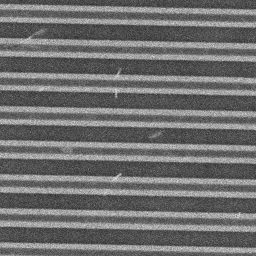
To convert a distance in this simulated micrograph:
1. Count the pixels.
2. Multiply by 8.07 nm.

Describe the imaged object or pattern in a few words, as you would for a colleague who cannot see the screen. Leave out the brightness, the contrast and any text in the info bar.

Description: parallel lines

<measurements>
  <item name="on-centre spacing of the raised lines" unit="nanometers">275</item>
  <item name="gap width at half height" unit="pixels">20.9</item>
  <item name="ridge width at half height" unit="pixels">12.8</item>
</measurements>